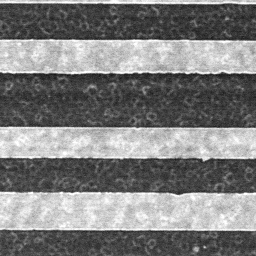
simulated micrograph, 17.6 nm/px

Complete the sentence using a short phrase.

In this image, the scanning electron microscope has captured one or a few lines or trenches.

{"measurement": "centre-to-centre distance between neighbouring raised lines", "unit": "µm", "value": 1.36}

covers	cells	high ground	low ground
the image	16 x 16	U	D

DDDDDDDDDDDDDDDD
DDDDDDDDDDDDDDDD
DDDDDDDDDDDDDDDD
UUUUUUUUUUUUUUUU
UUUUUUUUUDDUUUUU
DDDDDDDDDDDDDDDD
DDDDDDDDDDDDDDDD
DDDDDDDDDDDDDDDD
UUUUUUUUUUUUUUUU
UUUUUUUUUUUUUUUU
DDDDDDDDDDDDDDDD
DDDDDDDDDDDDDDDD
UUUUUUUUUUUUUUUU
UUUUUUUUUUUUUUUU
DDDDDDDDDDDDDDDD
DDDDDDDDDDDDDDDD